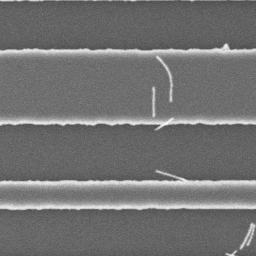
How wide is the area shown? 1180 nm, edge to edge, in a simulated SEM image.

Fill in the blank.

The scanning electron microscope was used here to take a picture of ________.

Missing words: lines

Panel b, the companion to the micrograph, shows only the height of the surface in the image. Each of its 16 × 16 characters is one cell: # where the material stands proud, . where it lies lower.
................
................
................
################
################
################
################
################
................
................
................
################
################
................
................
................